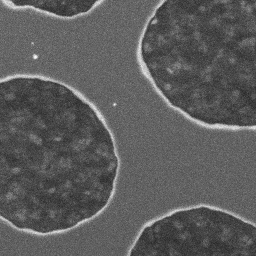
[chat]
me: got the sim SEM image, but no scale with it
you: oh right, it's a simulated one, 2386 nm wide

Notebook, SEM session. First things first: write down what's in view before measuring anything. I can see holes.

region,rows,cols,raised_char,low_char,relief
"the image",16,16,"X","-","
XX----XXXX------
XXXXXXXXX-------
XXXXXXXXX-------
XXXXXXXXX-------
XXXXXXXXX-------
----XXXXXX------
------XXXXX-----
------XXXXXX----
-------XXXXXXXXX
-------XXXXXXXXX
-------XXXXXXXXX
-------XXXXXXXXX
-------XXXXXXXXX
------XXXXX----X
XXXXXXXXX-------
XXXXXXXX--------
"